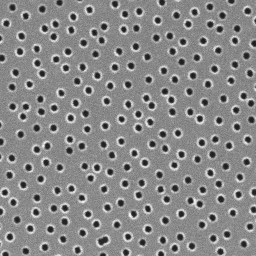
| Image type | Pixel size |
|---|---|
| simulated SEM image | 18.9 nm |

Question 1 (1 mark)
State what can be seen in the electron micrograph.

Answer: a regular array of holes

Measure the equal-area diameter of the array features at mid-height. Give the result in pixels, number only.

7.14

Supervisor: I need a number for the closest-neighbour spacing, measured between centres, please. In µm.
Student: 0.273